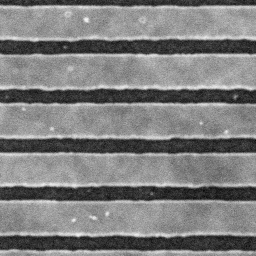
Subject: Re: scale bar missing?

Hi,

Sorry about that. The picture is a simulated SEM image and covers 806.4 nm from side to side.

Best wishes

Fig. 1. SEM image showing lines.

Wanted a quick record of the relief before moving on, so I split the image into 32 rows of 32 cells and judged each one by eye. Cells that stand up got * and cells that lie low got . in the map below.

................................
********************************
********************************
********************************
********************************
................................
................................
********************************
********************************
********************************
********************************
................................
................................
********************************
********************************
********************************
********************************
................................
................................
********************************
********************************
********************************
********************************
................................
................................
********************************
********************************
********************************
********************************
.........*.*.....******.........
................................
********************************